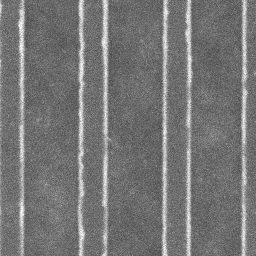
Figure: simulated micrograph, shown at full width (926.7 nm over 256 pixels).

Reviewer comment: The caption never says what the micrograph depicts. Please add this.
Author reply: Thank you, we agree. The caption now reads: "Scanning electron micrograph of one or a few lines or trenches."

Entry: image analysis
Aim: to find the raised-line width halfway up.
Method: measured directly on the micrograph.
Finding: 99.2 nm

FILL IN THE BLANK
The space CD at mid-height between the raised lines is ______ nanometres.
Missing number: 205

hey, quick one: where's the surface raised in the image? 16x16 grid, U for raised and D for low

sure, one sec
UDDDDUUDDDUUDDDU
UDDDDUUDDDUUDDDU
UDDDDUUDDDUUDDDU
UDDDDUUDDDUUDDDU
UDDDDUUDDDUUDDDU
UDDDDUUDDDUUDDDU
UDDDDUUDDDUUDDDU
UDDDDUUDDDUUDDDU
UDDDDUUDDDUUDDDU
UDDDDUUDDDUUDDDU
UDDDDUUDDDUUDDDU
UDDDDUUDDDUUDDDU
UDDDDUUDDDUUDDDU
UDDDDUUDDDUUDDDU
UDDDDUUDDDUUDDDU
UDDDDUUDDDUUDDDU